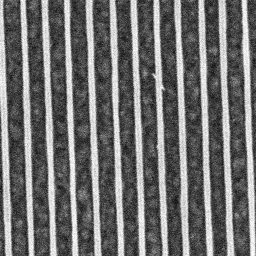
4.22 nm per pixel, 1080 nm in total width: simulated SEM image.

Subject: parallel lines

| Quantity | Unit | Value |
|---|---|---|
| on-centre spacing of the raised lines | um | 0.0935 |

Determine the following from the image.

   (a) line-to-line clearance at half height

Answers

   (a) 71.7 nanometres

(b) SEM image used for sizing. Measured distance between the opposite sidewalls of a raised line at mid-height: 21.6 nm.